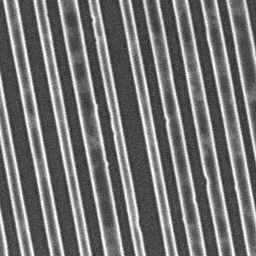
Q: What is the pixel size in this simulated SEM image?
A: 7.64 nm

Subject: parallel lines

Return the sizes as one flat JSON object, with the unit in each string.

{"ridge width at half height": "95.8 nm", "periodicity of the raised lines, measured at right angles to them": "214 nm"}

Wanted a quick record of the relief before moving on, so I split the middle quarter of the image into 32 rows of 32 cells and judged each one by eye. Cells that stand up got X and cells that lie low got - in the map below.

--XXXX---XX------XXX---XXXX---XX
--XXXX----XX-----XXX---XXXX---XX
--XXXX----XX-----XXX---XXXX----X
--XXXXX---XX------XX----XXX----X
--XXXXX---XX------XX----XXX----X
---XXXX---XX------XX----XXX----X
---XXXX---XXX-----XXX---XXXX---X
---XXXX----XX-----XXX---XXXX----
---XXXXX---XX------XX----XXX----
---XXXXX---XX------XX----XXX----
----XXXX---XX------XX----XXXX---
----XXXX---XX------XXX---XXXX---
----XXXX----XX-----XXX---XXXX---
----XXXX----XX------XX----XXX---
X---XXXXX---XX------XX----XXX---
X----XXXX---XX------XX----XXX---
X----XXXX---XX------XXX---XXXX--
X----XXXX----XX-----XXX---XXXX--
X----XXXX----XX------XX---XXXX--
X----XXXXX---XX------XX----XXX--
XX---XXXXX---XX------XX----XXX--
XX----XXXX---XX------XX----XXXX-
XX----XXXX---XXX-----XXX---XXXX-
XX----XXXX----XX-----XXX---XXXX-
XX----XXXXX---XX------XX----XXX-
XXX---XXXXX---XX------XX----XXX-
XXX----XXXX---XX------XX----XXX-
-XX----XXXX---XX------XXX---XXXX
-XX----XXXX----XX-----XXX---XXXX
-XX----XXXX----XX------XX---XXXX
-XX----XXXXX---XX------XX----XXX
-XXX---XXXXX---XX------XX----XXX